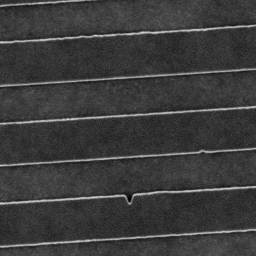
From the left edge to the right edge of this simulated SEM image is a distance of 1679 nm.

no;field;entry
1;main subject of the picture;one or a few lines or trenches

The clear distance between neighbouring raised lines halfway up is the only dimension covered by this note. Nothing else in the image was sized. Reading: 240 nm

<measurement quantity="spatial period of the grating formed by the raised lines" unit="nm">526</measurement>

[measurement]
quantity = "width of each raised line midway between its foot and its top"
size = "285 nm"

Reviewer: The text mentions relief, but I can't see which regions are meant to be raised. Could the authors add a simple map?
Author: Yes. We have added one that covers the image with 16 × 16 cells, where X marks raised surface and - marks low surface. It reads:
----------------
----------------
--XXXXXXXXXXXXXX
XXXXXXXXXXXXXXXX
XXXXXXXXXXXXXX--
----------------
----------------
---XXXXXXXXXXXXX
XXXXXXXXXXXXXXXX
XXXXXXXXXXXXX---
----------------
----------------
---XXXXXXXXXXXXX
XXXXXXXXXXXXXXXX
XXXXXXXXXXXXXX--
----------------